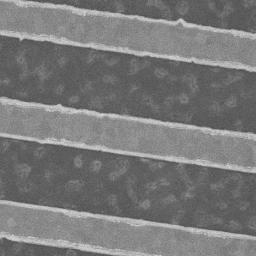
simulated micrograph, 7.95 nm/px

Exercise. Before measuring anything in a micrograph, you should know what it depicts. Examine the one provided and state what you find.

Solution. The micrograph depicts one or a few lines or trenches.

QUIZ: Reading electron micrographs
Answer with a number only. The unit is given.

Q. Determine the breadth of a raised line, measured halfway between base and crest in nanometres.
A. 274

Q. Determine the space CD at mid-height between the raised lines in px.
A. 65.9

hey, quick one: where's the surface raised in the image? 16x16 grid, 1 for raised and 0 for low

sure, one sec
1111000000000000
1111111111110000
0001111111111111
0000000000111111
0000000000000000
0000000000000000
1100000000000000
1111111110000000
0111111111111111
0000000111111111
0000000000000011
0000000000000000
0000000000000000
1111110000000000
1111111111111000
0000011111111111